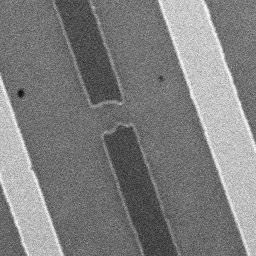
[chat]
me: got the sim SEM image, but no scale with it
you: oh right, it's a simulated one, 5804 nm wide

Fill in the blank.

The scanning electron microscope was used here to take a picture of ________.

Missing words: one or a few lines or trenches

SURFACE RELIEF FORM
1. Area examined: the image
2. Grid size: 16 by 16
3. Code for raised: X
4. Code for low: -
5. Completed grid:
---XXX----XXX---
----XX----XXX---
----XX-----XXX--
-----XX----XXX--
-----XX-----XX--
-----XXX----XXX-
X-----------XXX-
X------------XX-
X------XX----XXX
XX-----XX----XXX
XX-----XX-----XX
XX-----XXX----XX
-XX-----XX----XX
-XX-----XX-----X
-XX-----XXX----X
--XX-----XX----X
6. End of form